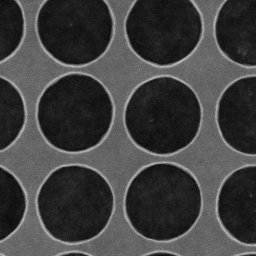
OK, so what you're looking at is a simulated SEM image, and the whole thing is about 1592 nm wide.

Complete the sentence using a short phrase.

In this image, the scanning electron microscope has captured holes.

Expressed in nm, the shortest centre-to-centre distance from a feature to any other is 543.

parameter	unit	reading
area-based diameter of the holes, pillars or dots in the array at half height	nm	476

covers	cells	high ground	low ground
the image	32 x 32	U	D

DDUUUDDDDDDDDUUUUDDDDDDDUUUUDDDD
DDDUUDDDDDDDDDUUDDDDDDDDDUUDDDDD
DDDUUDDDDDDDDDUUDDDDDDDDDUUDDDDD
DDDUUDDDDDDDDDUUDDDDDDDDDUUDDDDD
DDDUUDDDDDDDDDUUDDDDDDDDDUUDDDDD
DDUUUDDDDDDDDDUUDDDDDDDDDUUDDDDD
DDUUUUDDDDDDDUUUUDDDDDDDUUUUDDDD
UUUUUUUDDDDDUUUUUUDDDDDUUUUUUDDD
UUUUUUUUUUUUUUUUUUUUUUUUUUUUUUUU
UUUUUUUUDDDUUUUUUUUUUUUUUUUUUUUU
DUUUUUDDDDDDDUUUUUDDDDDUUUUUUDDD
DDUUUUDDDDDDDUUUUDDDDDDDUUUUDDDD
DDDUUDDDDDDDDDUUDDDDDDDDDUUDDDDD
DDDUUDDDDDDDDDUUDDDDDDDDDUUDDDDD
DDDUUDDDDDDDDDUUDDDDDDDDDUUDDDDD
DDDUUDDDDDDDDDUUDDDDDDDDDUUDDDDD
DDUUUDDDDDDDDUUUDDDDDDDDDUUUDDDD
DDUUUUDDDDDDDUUUUDDDDDDDUUUUDDDD
DUUUUUUDDDDUUUUUUUDDDDDUUUUUUDDD
UUUUUUUUUUUUUUUUUUUUUUUUUUUUUUUU
UUUUUUUUUUUUUUUUUUUUDUUUUUUUUUUU
DUUUUUUDDDDDUUUUUDDDDDDUUUUUUDDD
DDUUUUDDDDDDDUUUUDDDDDDDUUUUDDDD
DDDUUDDDDDDDDDUUDDDDDDDDDUUUDDDD
DDDUUDDDDDDDDDUUDDDDDDDDDUUDDDDD
DDDUUDDDDDDDDDUUDDDDDDDDDUUDDDDD
DDDUUDDDDDDDDDUUDDDDDDDDDUUDDDDD
DDDUUDDDDDDDDDUUDDDDDDDDDUUUDDDD
DDUUUUDDDDDDDUUUUDDDDDDDUUUUDDDD
DUUUUUUDDDDDUUUUUUDDDDUUUUUUUDDD
UUUUUUUUUUUUUUUUUUUUUUUUUUUUUUUD
UUUUUUUUUUUUUUUUUUUUUUUUUUUUUUUU